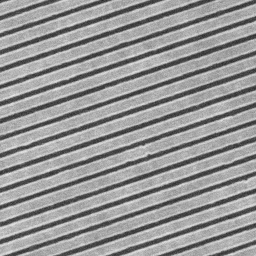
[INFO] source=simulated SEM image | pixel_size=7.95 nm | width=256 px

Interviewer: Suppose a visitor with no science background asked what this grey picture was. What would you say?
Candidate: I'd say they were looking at parallel lines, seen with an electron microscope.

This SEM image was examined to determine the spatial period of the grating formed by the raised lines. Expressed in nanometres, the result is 130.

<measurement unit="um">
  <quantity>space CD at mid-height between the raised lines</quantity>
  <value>0.0471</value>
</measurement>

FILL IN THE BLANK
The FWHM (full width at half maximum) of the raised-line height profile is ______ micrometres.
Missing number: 0.0781